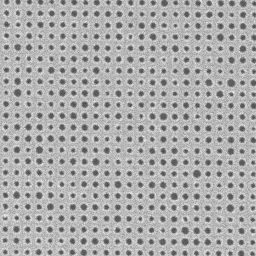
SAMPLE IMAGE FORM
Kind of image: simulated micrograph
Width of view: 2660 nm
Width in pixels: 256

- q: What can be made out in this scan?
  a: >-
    a regular array of holes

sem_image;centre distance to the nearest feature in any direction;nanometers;115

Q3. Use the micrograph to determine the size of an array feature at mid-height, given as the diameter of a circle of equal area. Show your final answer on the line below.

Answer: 60.9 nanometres